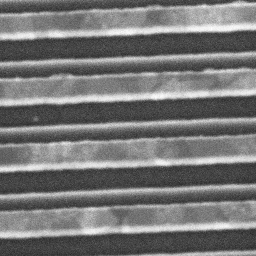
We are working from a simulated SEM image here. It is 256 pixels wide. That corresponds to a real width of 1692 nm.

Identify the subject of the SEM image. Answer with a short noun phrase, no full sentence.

lines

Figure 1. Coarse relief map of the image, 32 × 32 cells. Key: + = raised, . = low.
..............................++
.........+++++++++++++++++++++++
++++++++++++++++++++++++++++++++
++++++++++++++++++++++++++++++++
+++++++++.......................
................................
................................
................................
................................
.............+++++++++++++++++++
++++++++++++++++++++++++++++++++
++++++++++++++++++++++++++++++++
++++++++++++++..................
................................
................................
................................
................................
.................+++++++++++++++
++++++++++++++++++++++++++++++++
++++++++++++++++++++++++++++++++
++++++++++++++++++++++..........
................................
................................
................................
................................
........................++++++++
++++++++++++++++++++++++++++++++
++++++++++++++++++++++++++++++++
++++++++++++++++++++++++++++....
+++.............................
................................
................................